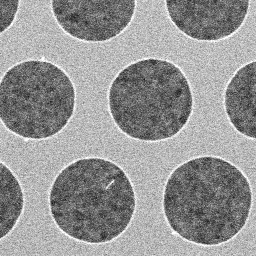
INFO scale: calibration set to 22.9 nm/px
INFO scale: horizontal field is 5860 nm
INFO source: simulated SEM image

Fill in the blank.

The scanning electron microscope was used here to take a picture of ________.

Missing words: raised bodies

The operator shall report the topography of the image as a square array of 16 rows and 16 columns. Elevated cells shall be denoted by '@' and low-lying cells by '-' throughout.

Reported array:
@--@@@@@--@@@@@@
@---@@@@---@@@@-
-----@@-----@@--
----------------
@@@@----@@@----@
@@@@@--@@@@@--@@
@@@@@--@@@@@--@@
@@@@---@@@@@--@@
-@@-----@@@----@
----------------
----@@@----@@@@-
@--@@@@@--@@@@@@
@--@@@@@--@@@@@@
@--@@@@@--@@@@@@
@---@@@@---@@@@-
----------------